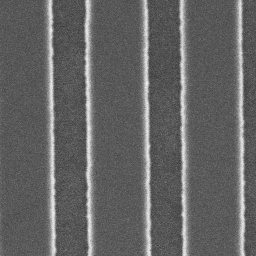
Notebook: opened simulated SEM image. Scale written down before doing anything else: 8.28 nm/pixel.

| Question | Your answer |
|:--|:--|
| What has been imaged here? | lines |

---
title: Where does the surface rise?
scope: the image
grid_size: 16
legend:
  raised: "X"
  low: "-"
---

XXX--XXXX--XXXX-
XXX--XXXX--XXXX-
XXX--XXXX--XXXX-
XXX--XXXX--XXXX-
XXX--XXXX--XXXX-
XXX--XXXX--XXXX-
XXX--XXXX--XXXX-
XXX--XXXX--XXXX-
XXX--XXXX--XXXX-
XXX--XXXX--XXXX-
XXX--XXXX--XXXX-
XXX--XXXX--XXXX-
XXX--XXXX--XXXX-
XXX--XXXX--XXXX-
XXX---XXX--XXXX-
XXX---XXX--XXXX-